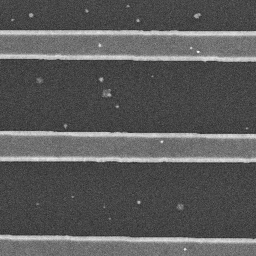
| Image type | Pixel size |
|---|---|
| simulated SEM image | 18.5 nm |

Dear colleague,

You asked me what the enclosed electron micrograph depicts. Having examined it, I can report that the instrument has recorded lines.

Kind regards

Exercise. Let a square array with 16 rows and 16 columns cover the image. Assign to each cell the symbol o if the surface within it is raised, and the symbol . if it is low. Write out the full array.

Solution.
................
................
oooooooooooooooo
oooooooooooooooo
................
................
................
................
oooooooooooooooo
oooooooooooooooo
................
................
................
................
................
oooooooooooooooo